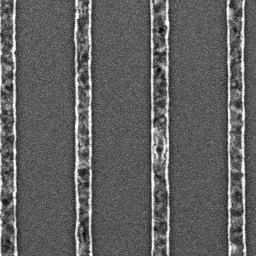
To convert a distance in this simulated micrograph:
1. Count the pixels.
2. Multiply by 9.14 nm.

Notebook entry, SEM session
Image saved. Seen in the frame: one or a few lines or trenches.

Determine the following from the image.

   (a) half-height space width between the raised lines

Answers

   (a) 564 nm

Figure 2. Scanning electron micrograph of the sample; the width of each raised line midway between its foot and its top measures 139 nm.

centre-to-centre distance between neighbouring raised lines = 698 nm